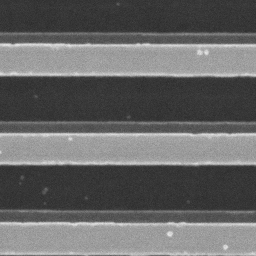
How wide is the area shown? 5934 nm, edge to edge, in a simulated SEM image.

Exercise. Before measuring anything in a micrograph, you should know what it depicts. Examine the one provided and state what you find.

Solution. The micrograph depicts lines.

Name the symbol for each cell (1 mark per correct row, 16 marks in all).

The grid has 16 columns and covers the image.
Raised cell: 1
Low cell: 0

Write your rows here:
0000000000000000
0000000000000000
1111111111111111
1111111111111111
1111111111111111
0000000000000000
0000000000000000
0000000000000000
1111111111111111
1111111111111111
0000000000000000
0000000000000000
0000000000000000
1111111111111111
1111111111111111
1111111111111111